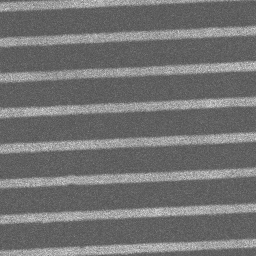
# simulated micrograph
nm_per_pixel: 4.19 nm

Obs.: parallel lines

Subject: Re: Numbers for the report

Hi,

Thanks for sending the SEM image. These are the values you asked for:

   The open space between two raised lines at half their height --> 0.113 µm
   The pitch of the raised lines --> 148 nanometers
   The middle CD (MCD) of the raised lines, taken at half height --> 32.4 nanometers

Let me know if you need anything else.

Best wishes